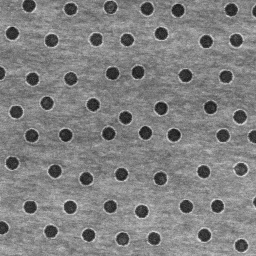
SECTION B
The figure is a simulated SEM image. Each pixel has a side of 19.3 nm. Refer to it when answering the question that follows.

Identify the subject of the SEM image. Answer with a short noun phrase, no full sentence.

a regular array of holes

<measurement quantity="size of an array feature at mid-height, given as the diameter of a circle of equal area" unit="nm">266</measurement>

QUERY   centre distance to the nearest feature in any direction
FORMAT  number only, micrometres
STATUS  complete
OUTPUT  0.598